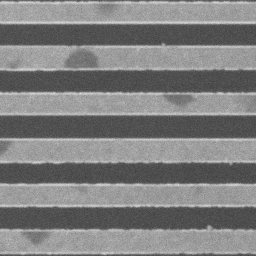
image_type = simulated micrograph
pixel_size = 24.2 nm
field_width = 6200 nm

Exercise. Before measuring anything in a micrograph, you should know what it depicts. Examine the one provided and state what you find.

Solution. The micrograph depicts lines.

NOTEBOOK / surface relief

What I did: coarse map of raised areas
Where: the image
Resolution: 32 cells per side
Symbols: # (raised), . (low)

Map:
################################
################################
################################
................................
................................
................................
################################
################################
################################
................................
................................
................................
################################
################################
................................
................................
................................
################################
################################
################################
................................
................................
................................
################################
################################
################################
................................
................................
................................
################################
################################
################################